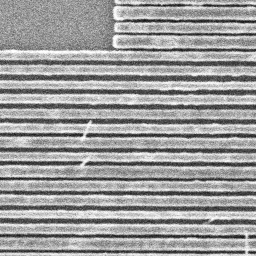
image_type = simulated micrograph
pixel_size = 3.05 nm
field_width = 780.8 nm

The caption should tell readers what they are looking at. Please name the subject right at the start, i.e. parallel lines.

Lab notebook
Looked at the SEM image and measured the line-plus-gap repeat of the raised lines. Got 44.1 nm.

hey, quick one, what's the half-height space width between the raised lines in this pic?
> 17.5 nm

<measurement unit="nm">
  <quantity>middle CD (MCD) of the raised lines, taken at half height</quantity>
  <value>26.7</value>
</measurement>